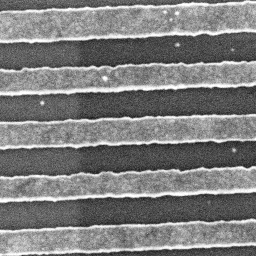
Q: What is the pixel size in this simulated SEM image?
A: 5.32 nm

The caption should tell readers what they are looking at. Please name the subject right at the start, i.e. lines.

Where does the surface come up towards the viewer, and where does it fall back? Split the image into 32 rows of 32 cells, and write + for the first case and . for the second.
.......................+++.+++++
++++++++++++++++++++++++++++++++
++++++++++++++++++++++++++++++++
++++++++++++++++++++++++++++++++
+++++++++++++++++++.............
................................
................................
................................
.....+..++++++++++++++++++++++++
++++++++++++++++++++++++++++++++
++++++++++++++++++++++++++++++++
+++++++++.......................
................................
................................
........................++++++++
++++++++++++++++++++++++++++++++
++++++++++++++++++++++++++++++++
++++++++++++++++++++++++++++++++
+...............................
................................
................................
................++++++++++++++++
++++++++++++++++++++++++++++++++
++++++++++++++++++++++++++++++++
++++++++++++++++++++............
................................
................................
...............................+
.......+++++++++++++++++++++++++
++++++++++++++++++++++++++++++++
++++++++++++++++++++++++++++++++
+++++++++++++...................